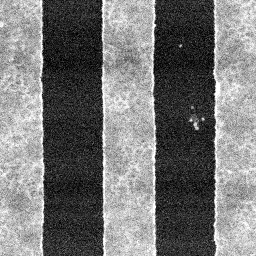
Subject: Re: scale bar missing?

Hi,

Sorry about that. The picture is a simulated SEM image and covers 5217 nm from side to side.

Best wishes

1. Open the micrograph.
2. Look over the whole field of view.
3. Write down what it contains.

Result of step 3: one or a few lines or trenches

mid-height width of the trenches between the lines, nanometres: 1250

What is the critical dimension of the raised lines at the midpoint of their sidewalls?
1040 nanometres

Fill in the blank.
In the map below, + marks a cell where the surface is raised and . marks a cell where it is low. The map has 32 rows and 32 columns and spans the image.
+++++........++++++........+++++
+++++........++++++........+++++
+++++........++++++........+++++
+++++........++++++........+++++
+++++........++++++........+++++
+++++........++++++........+++++
+++++........++++++........+++++
+++++........++++++........+++++
+++++........++++++........+++++
+++++........++++++........+++++
+++++........++++++........+++++
+++++........++++++........+++++
+++++........++++++........+++++
+++++........++++++........+++++
+++++........++++++........+++++
+++++........++++++........+++++
+++++........++++++........+++++
+++++........++++++........+++++
+++++........++++++........+++++
+++++........++++++........+++++
+++++........++++++........+++++
+++++........++++++........+++++
+++++........++++++........+++++
+++++........++++++........+++++
+++++........++++++........+++++
+++++........++++++........+++++
+++++........++++++........+++++
+++++........++++++........+++++
+++++........++++++........+++++
+++++........++++++........+++++
+++++........++++++........+++++
+++++........++++++........+++++